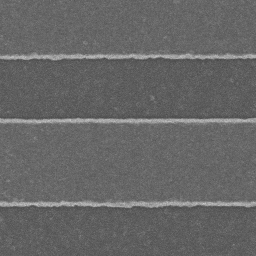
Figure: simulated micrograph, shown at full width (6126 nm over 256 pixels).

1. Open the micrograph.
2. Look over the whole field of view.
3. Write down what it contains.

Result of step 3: one or a few lines or trenches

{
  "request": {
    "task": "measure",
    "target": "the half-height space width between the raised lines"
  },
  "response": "64.3 px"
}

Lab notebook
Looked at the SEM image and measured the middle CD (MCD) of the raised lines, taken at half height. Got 1980 nanometres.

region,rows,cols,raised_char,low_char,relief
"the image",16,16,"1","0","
1111111111111111
1111111111111111
1111111111111111
1101010100111111
0000000000000000
0000000000000000
0000000000000000
0000000000000000
1111111111111111
1111111111111111
1111111111111111
1111111111111111
1111111111111111
0000000000000000
0000000000000000
0000000000000000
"